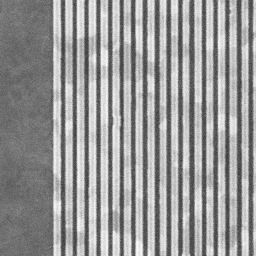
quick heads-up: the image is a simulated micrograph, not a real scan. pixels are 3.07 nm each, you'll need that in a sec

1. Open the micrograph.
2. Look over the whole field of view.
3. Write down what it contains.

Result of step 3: parallel lines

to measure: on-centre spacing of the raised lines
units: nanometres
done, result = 36.1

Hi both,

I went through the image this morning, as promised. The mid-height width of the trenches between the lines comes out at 0.0181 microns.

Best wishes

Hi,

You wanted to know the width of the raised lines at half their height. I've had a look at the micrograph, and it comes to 5.9 pixels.